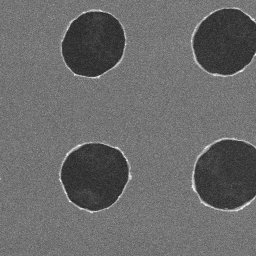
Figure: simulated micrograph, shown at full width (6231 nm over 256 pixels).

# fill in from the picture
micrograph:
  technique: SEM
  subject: holes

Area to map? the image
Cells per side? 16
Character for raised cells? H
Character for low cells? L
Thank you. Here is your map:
HHHHHHHHHHHHHHHH
HHHHHLLLHHHHHLLL
HHHHLLLLHHHHLLLL
HHHHLLLLHHHHLLLL
HHHHHLLHHHHHHLLH
HHHHHHHHHHHHHHHH
HHHHHHHHHHHHHHHH
HHHHHHHHHHHHHHHH
HHHHHHHHHHHHHHHH
HHHHHLLHHHHHHLLL
HHHHLLLLHHHHLLLL
HHHHLLLLHHHHLLLL
HHHHLLLHHHHHHLLL
HHHHHHHHHHHHHHHH
HHHHHHHHHHHHHHHH
HHHHHHHHHHHHHHHH